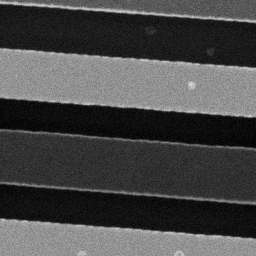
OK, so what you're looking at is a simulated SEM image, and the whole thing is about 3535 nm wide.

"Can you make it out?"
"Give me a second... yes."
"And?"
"lines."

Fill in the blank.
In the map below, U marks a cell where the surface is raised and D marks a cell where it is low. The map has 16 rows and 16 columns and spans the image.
DDDDUUUUUUUUUUUU
DDDDDDDDDDDDDDDD
DDDDDDDDDDDDDDDD
UUUUUUDDDDDDDDDD
UUUUUUUUUUUUUUUU
UUUUUUUUUUUUUUUU
DDDDDUUUUUUUUUUU
DDDDDDDDDDDDDDDD
UUUUUUDDDDDDDDDD
UUUUUUUUUUUUUUUU
UUUUUUUUUUUUUUUU
UUUUUUUUUUUUUUUU
DDDDDDDDDDDDDUUU
DDDDDDDDDDDDDDDD
UUUUUUUUUUDDDDDD
UUUUUUUUUUUUUUUU